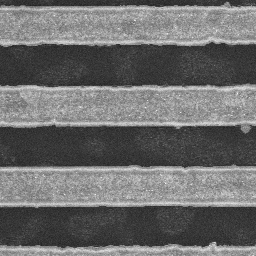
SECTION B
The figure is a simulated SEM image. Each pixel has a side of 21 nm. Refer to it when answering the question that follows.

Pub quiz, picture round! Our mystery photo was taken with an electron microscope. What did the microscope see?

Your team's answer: one or a few lines or trenches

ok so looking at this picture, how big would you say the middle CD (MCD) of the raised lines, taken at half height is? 717 nanometers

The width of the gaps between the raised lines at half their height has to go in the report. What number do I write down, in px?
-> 46.4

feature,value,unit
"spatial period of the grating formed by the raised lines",1690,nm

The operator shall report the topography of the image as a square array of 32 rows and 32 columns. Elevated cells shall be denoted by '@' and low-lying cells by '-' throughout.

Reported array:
--------------------------------
@@@@@@@@@@@@@@@@@@@@@@@@@@@@@@@@
@@@@@@@@@@@@@@@@@@@@@@@@@@@@@@@@
@@@@@@@@@@@@@@@@@@@@@@@@@@@@@@@@
@@@@@@@@@@@@@@@@@@@@@@@@@@@@@@@@
--------------------------------
--------------------------------
--------------------------------
--------------------------------
--------------------------------
--------------------------------
@@@@@@@@@@@@@@@@@@@@@@@@@@@@@@@@
@@@@@@@@@@@@@@@@@@@@@@@@@@@@@@@@
@@@@@@@@@@@@@@@@@@@@@@@@@@@@@@@@
@@@@@@@@@@@@@@@@@@@@@@@@@@@@@@@@
---@----------@-----------------
--------------------------------
--------------------------------
--------------------------------
--------------------------------
--------------------------------
@@@@@@@@@@@@@@@@@@@@@@@@@@@@@@@@
@@@@@@@@@@@@@@@@@@@@@@@@@@@@@@@@
@@@@@@@@@@@@@@@@@@@@@@@@@@@@@@@@
@@@@@@@@@@@@@@@@@@@@@@@@@@@@@@@@
--------------------------------
--------------------------------
--------------------------------
--------------------------------
--------------------------------
--------------------------------
@@@@@@@@@@@@-@@@@@@@@@@@@@@@@@@@